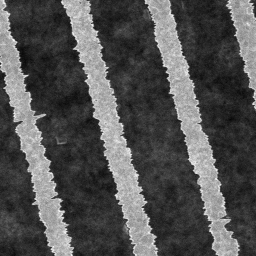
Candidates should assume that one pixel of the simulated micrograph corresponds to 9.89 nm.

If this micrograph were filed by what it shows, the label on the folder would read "one or a few lines or trenches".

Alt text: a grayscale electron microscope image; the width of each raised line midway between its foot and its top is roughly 191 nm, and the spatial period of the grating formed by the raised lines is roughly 79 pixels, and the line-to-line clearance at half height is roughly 574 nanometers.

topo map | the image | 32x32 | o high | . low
o.......ooo.......ooo........oo.
o.......ooo.......ooo........ooo
o........oo........ooo.......ooo
o........ooo.......ooo.......ooo
o........ooo.......ooo........oo
oo........oo........oo........oo
oo........ooo.......ooo.......oo
oo........ooo.......ooo........o
ooo........oo........oo........o
.oo........oo........oo........o
.oo........ooo.......ooo.......o
.oo........ooo........oo........
.ooo........oo........ooo.......
..oo........ooo.......ooo.......
..ooo.......ooo.......ooo.......
..oo.........oo........oo.......
..ooo........oo........oo.......
...oo..o.....ooo.......ooo......
...oo........ooo........oo......
...ooo.......ooo........ooo.....
....oo........oo........ooo.....
....oo........ooo.......ooo.....
....ooo.......ooo........oo.....
....ooo........oo........oo.....
....ooo........ooo.......ooo....
.....ooo.......ooo........oo....
.....ooo.......ooo........oo....
.....ooo........oo........oo....
......oo........ooo.......oo....
......ooo.......ooo........oo...
......ooo........oo........ooo..
.......oo........ooo.......ooo..